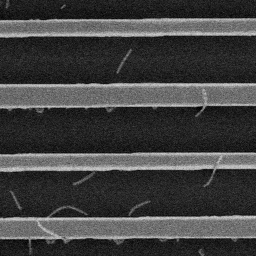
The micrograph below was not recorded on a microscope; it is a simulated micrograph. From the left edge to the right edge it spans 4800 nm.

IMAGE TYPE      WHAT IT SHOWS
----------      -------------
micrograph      lines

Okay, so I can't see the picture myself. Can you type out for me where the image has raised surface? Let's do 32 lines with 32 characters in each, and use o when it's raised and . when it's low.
................................
................................
......oooooooooooooooooooooooooo
oooooooooooooooooooooooooooooooo
................................
................................
................................
................................
................................
................................
....................ooooo.oooooo
oooooooooooooooooooooooooooooooo
oooooooooooooooooooooooooooooooo
................................
................................
................................
................................
................................
................................
oooooooooooooooooooooooooooooooo
oooooooooooooooooooooooooooooooo
................................
................................
................................
................................
................................
................................
oooooooooooooooooooooooooooooooo
oooooooooooooooooooooooooooooooo
oooooooooooooooooooooooooooooooo
................................
................................